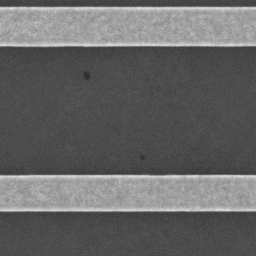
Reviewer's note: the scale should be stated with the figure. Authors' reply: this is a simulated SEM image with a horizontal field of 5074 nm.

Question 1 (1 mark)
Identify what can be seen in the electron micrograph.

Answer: wiring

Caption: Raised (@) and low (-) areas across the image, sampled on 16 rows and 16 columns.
@@@@@@@@@@@@@@@@
@@@@@@@@@@@@@@@@
@@@@@@@@@@@@@@@@
----------------
----------------
----------------
----------------
----------------
----------------
----------------
----------------
@@@@@@@@@@@@@@@@
@@@@@@@@@@@@@@@@
----------------
----------------
----------------